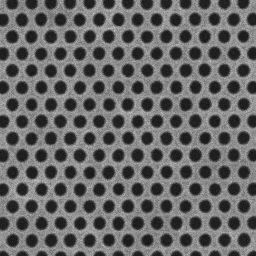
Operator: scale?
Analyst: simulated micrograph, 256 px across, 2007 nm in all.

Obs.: a regular array of holes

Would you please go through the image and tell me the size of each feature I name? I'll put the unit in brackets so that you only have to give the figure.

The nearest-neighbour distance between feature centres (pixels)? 19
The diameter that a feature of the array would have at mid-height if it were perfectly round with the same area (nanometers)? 104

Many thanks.